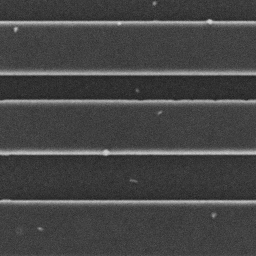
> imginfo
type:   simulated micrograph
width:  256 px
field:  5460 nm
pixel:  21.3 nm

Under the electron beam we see lines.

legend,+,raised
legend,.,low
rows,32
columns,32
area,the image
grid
................................
................................
................................
++++++++++++++++++++++++++++++++
++++++++++++++++++++++++++++++++
++++++++++++++++++++++++++++++++
++++++++++++++++++++++++++++++++
++++++++++++++++++++++++++++++++
++++++++++++++++++++++++++++++++
................................
................................
................................
................................
++++++++++++++++++++++++++++++++
++++++++++++++++++++++++++++++++
++++++++++++++++++++++++++++++++
++++++++++++++++++++++++++++++++
++++++++++++++++++++++++++++++++
++++++++++++++++++++++++++++++++
................................
................................
................................
................................
................................
................................
++++++++++++++++++++++++++++++++
++++++++++++++++++++++++++++++++
++++++++++++++++++++++++++++++++
++++++++++++++++++++++++++++++++
++++++++++++++++++++++++++++++++
++++++++++++++++++++++++++++++++
++++++++++++++++++++++++++++++++